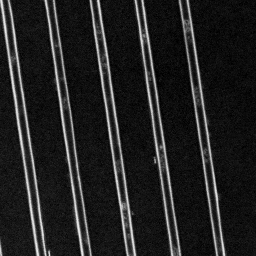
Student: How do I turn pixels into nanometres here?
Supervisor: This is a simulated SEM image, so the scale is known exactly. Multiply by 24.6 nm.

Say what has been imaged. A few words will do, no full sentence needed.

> parallel lines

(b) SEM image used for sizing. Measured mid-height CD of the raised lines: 219 nanometres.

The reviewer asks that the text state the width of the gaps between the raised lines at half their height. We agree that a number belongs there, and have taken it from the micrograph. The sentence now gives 880 nanometres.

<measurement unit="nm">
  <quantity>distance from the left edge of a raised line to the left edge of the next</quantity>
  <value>1090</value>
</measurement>